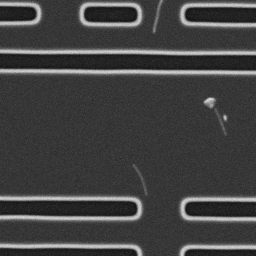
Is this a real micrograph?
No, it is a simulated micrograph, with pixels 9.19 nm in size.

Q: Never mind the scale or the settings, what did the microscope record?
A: groups of lines, slits or small figures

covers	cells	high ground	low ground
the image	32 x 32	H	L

HHHHHHHHHHHHHHHHHHHHHHHHHHHHHHHH
LLLLLHHHHHLLLLLLLHHHHHHLLLLLLLLL
LLLLHHHHHHLLLLLLLHHHHHHLLLLLLLLL
HHHHHHHHHHHHHHHHHHHHHHHHHHHHHHHH
HHHHHHHHHHHHHHHHHHHHHHHHHHHHHHHH
HHHHHHHHHHHHHHHHHHHHHHHHHHHHHHHH
LLLHHHHHHHHHHHHHHHHHHHHHHHHHHHHH
LLLLLLLLLLLLLLLLLLLLLLLLLLLLLLLL
LLLLLLLLLLLLLLLLLLLLLLLLLLLLLLLL
HHHHHHHHHHHHHHHHHHHHHHHHHHHHHHHH
HHHHHHHHHHHHHHHHHHHHHHHHHHHHHHHH
HHHHHHHHHHHHHHHHHHHHHHHHHHHHHHHH
HHHHHHHHHHHHHHHHHHHHHHHHHHHHHHHH
HHHHHHHHHHHHHHHHHHHHHHHHHHHHHHHH
HHHHHHHHHHHHHHHHHHHHHHHHHHHHHHHH
HHHHHHHHHHHHHHHHHHHHHHHHHHHHHHHH
HHHHHHHHHHHHHHHHHHHHHHHHHHHHHHHH
HHHHHHHHHHHHHHHHHHHHHHHHHHHHHHHH
HHHHHHHHHHHHHHHHHHHHHHHHHHHHHHHH
HHHHHHHHHHHHHHHHHHHHHHHHHHHHHHHH
HHHHHHHHHHHHHHHHHHHHHHHHHHHHHHHH
HHHHHHHHHHHHHHHHHHHHHHHHHHHHHHHH
HHHHHHHHHHHHHHHHHHHHHHHHHHHHHHHH
HHHHHHHHHHHHHHHHHHHHHHHHHHHHHHHH
HHHHHHHHHHHHHHHHHHHHHHHHHHHHHHHH
LLLLLLLLLLLLLLLLLHHHHHHLLLLLLLLL
LLLLLLLLLLLLLLLLLHHHHHHLLLLLLLLL
HHHHHHHHHHHHHHHHHHHHHHHHHHHHHHHH
HHHHHHHHHHHHHHHHHHHHHHHHHHHHHHHH
HHHHHHHHHHHHHHHHHHHHHHHHHHHHHHHH
HHHHHHHHHHHHHHHHHHHHHHHHHHHHHHHH
LLLLLLLLLLLLLLLLLHHHHHHLLLLLLLLL